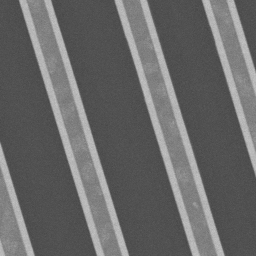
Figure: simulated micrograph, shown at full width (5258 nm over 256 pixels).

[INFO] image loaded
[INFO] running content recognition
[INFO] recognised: one or a few lines or trenches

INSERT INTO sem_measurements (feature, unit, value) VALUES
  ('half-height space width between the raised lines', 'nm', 1370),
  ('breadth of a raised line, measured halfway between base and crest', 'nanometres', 484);